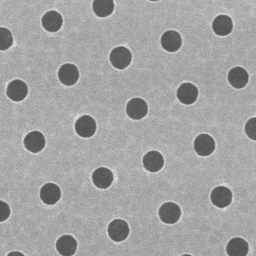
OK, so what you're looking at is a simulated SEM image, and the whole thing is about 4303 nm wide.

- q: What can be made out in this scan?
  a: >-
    a regular array of holes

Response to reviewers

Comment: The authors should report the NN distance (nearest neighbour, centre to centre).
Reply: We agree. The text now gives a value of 898 nanometres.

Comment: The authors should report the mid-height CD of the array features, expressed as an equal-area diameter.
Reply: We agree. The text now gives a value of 377 nm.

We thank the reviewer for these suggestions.